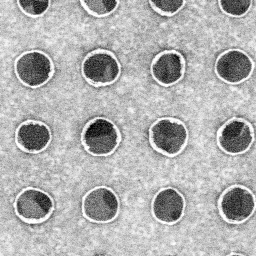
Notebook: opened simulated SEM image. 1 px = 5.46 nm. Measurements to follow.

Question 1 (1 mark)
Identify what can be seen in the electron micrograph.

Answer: a regular array of raised bodies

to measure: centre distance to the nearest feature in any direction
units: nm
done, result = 365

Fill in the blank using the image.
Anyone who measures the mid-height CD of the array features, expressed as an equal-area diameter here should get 36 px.